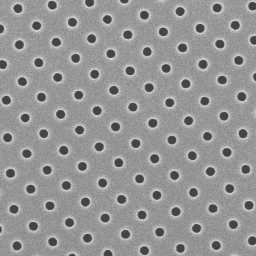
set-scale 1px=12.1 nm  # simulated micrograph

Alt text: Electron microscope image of a regular array of holes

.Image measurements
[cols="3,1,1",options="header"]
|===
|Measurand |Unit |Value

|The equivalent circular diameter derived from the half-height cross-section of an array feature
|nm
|106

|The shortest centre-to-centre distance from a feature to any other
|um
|0.3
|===